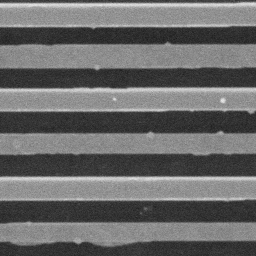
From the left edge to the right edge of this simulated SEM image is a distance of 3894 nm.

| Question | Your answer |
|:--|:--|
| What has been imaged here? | lines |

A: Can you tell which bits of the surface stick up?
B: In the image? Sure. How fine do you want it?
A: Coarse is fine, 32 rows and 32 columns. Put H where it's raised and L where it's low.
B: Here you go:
HHHHHHHHHHHHHHHHHHHHHHHHHHHHHHHH
HHHHHHHHHHHHHHHHHHHHHHHHHHHHHHHH
HHHHHHHHHHHHHHHHHHHHHHHHHHHHHHHH
LLLLLLLLLLLLLLLLLLLLLLLLLLLLLLLL
LLLLLLLLLLLLLLLLLLLLLLLLLLLLLLLL
LLLLLLLLLLLLLLLLLLLLLLLLLLLLLLLL
HHHHHHHHHHHHHHHHHHHHHHHHHHHHHHHH
HHHHHHHHHHHHHHHHHHHHHHHHHHHHHHHH
LLLLLLLLLLLHHLLLLLLLLLLLLLLLLLLL
LLLLLLLLLLLLLLLLLLLLLLLLLLLLLLLL
LLLLLLLLLLLLLLLLLLLLLLLLLLLLLLLL
HHHHHHHHHHHHHHHHHHHHHHHHHHHHHHHH
HHHHHHHHHHHHHHHHHHHHHHHHHHHHHHHH
HHHHHHHHHHHHHHHHHHHHHHHHHHHHHHHH
LLLLLLLLLLLLLLLLLLLLLLLLLLLLLLLL
LLLLLLLLLLLLLLLLLLLLLLLLLLLLLLLL
LLLLLLLLLLLLLLLLLLLLLLLLLLLLLLLL
HHHHHHHHHHHHHHHHHHHHHHHHHHHHHHHH
HHHHHHHHHHHHHHHHHHHHHHHHHHHHHHHH
LLLLLLLLLLLLLLLLLLLLLLLLLLLLLLLL
LLLLLLLLLLLLLLLLLLLLLLLLLLLLLLLL
LLLLLLLLLLLLLLLLLLLLLLLLLLLLLLLL
HHHHHHHHHHHHHHHHHHHHHHHHHHHHHHHH
HHHHHHHHHHHHHHHHHHHHHHHHHHHHHHHH
HHHHHHHHHHHHHHHHHHHHHHHHHHHHHHHH
LLLLLLLLLLLLLLLLLLLLLLLLLLLLLLLL
LLLLLLLLLLLLLLLLLLLLLLLLLLLLLLLL
LLLLLLLLLLLLLLLLLLLLLLLLLLLLLLLL
HHHHHHHHHHHHHHHHHHHHHHHHHHHHHHHH
HHHHHHHHHHHHHHHHHHHHHHHHHHHHHHHH
LLLLLLLLLLLLLLLLLLLLLLLLLLLLLLLL
LLLLLLLLLLLLLLLLLLLLLLLLLLLLLLLL